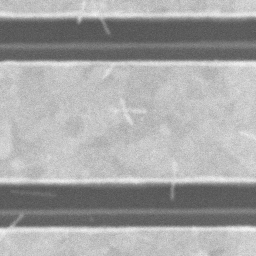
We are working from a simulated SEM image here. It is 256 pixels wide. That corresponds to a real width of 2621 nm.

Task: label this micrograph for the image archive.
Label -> lines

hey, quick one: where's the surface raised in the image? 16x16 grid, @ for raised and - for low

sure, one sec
@@@@@@@@@@@@@@@@
----------------
----------------
----------------
@@@@@@@@@@@@@@@@
@@@@@@@@@@@@@@@@
@@@@@@@@@@@@@@@@
@@@@@@@@@@@@@@@@
@@@@@@@@@@@@@@@@
@@@@@@@@@@@@@@@@
@@@@@@@@@@@@@@@@
----------------
----------------
----------------
@@@@@@@@@@@@@@@@
@@@@@@@@@@@@@@@@